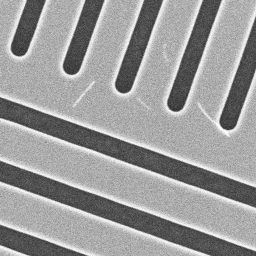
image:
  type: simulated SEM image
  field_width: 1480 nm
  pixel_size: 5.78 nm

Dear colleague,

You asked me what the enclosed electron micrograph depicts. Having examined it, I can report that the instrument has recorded groups of lines, slits or small figures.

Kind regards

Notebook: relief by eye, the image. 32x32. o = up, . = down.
ooo...oooo...ooooo..ooooo...oooo
ooo..ooooo...oooo...ooooo..ooooo
oo...ooooo..ooooo...oooo...ooooo
oo...oooo...ooooo..ooooo...oooo.
oo..ooooo...oooo...ooooo..ooooo.
o...ooooo..ooooo...oooo...ooooo.
oo.ooooo...ooooo..ooooo..ooooo..
oooooooo..ooooo...ooooo..ooooo..
oooooooo..ooooo..ooooo...ooooo..
ooooooooooooooo..ooooo..ooooo...
oooooooooooooo...ooooo..ooooo..o
ooooooooooooooo.ooooo...ooooo..o
.oooooooooooooooooooo..ooooo...o
....ooooooooooooooooo..ooooo..oo
.......ooooooooooooooooooooo..oo
oo........ooooooooooooooooo...oo
ooooo.......oooooooooooooooooooo
oooooooo.......ooooooooooooooooo
ooooooooooo.......oooooooooooooo
ooooooooooooo........ooooooooooo
.ooooooooooooooo........oooooooo
....ooooooooooooooo........ooooo
.......ooooooooooooooo.......ooo
oo........ooooooooooooooo.......
ooooo.......oooooooooooooooo....
oooooooo.......oooooooooooooooo.
ooooooooooo.......oooooooooooooo
ooooooooooooo........ooooooooooo
.oooooooooooooooo.......oooooooo
....ooooooooooooooo........ooooo
.......ooooooooooooooo.......ooo
oo........ooooooooooooooo.......